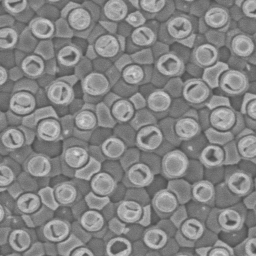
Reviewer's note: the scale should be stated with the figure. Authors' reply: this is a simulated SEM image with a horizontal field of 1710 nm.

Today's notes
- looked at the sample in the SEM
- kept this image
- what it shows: a regular array of raised bodies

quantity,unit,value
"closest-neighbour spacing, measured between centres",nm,134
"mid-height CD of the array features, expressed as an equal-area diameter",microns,0.127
